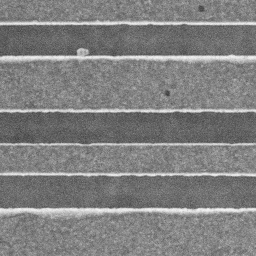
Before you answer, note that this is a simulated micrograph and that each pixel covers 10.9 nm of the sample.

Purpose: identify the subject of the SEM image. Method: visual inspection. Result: lines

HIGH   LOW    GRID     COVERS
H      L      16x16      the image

HHHHHHHHHHHHHHHH
HHHHHHHLHHHHHHHH
LLLLLLLLLLLLLLLL
LLLLLLLLLLLLLLLL
HHHHHHHHHHHHHHHH
HHHHHHHHHHHHHHHH
HHHHHHHHHHHHHHHH
LLLLLLLLLLLLLLLL
LLLLLLLLLLLLLLLL
HHHHHHHHHHHHHHHH
HHHHHHHHHHHHHHHH
LLLLLLLLLLLLLLLL
LLLLLLLLLLLLLLLL
HHHHHHHHHHHHHHHH
HHHHHHHHHHHHHHHH
HHHHHHHHHHHHHHHH